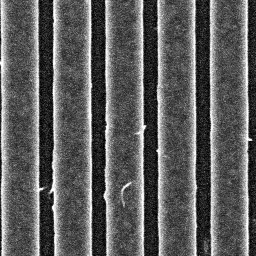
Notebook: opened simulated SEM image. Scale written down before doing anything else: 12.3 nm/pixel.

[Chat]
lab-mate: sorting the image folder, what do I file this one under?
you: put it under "parallel lines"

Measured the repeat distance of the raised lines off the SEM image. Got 642 nm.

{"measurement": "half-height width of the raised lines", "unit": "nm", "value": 453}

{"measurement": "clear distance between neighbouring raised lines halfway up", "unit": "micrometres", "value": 0.194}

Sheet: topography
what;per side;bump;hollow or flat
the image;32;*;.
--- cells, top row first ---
*****..****..*****..****..*****.
*****..****..*****..****..*****.
*****..****..*****..****..*****.
*****..****..*****..****..*****.
*****..****..*****..****..*****.
*****..****..*****..****..*****.
*****..****..*****..****..*****.
*****..****..*****..****..*****.
*****..****..*****..****..*****.
*****..****..*****..****..*****.
*****..****..*****..****..*****.
*****..****..*****..****..*****.
*****..****..*****..****..*****.
*****..****..*****..****..*****.
*****..****..*****..****..*****.
*****..****..*****..****..*****.
*****..****..*****..****..*****.
*****..****..*****..****..*****.
*****..****..*****..****..*****.
*****..****..*****..****..*****.
*****..****..*****..****..*****.
*****..****..*****..****..*****.
*****..****..*****..****..*****.
*****..****..*****..****..*****.
*****..****..*****..****..*****.
*****..****..*****..****..*****.
*****..****..*****..****..*****.
*****..****..*****..****..*****.
*****..****..*****..****..*****.
*****..****..*****..****..*****.
*****..****..*****..****..*****.
*****..****..*****..****...****.